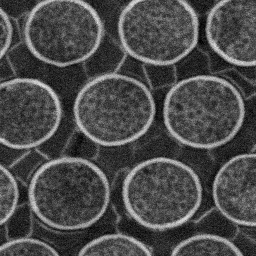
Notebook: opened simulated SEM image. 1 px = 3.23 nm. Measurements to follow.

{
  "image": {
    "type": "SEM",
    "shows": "raised bodies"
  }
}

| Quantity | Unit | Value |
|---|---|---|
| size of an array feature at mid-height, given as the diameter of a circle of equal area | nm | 235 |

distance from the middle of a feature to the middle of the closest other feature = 293 nanometres